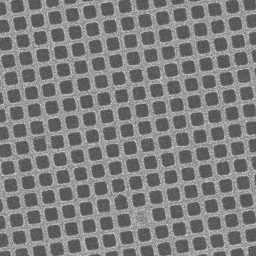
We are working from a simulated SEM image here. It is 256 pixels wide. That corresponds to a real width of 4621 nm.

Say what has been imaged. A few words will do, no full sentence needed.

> a regular array of holes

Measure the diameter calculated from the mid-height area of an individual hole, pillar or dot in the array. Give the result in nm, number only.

252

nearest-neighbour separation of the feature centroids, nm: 316